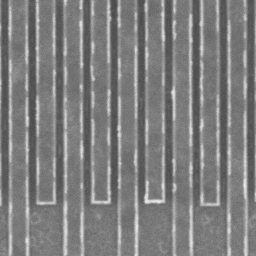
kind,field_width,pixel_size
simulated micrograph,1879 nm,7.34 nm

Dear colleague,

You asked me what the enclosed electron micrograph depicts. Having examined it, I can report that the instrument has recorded parallel lines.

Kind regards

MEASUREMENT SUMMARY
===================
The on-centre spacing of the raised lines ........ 0.201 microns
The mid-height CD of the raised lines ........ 136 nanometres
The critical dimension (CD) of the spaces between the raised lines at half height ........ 64.2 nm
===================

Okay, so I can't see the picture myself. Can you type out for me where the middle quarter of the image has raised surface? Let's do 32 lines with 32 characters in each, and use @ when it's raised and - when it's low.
@@@@@--@@@@---@@@@---@@@@--@@@@@
@@@@---@@@@---@@@@---@@@@--@@@@@
@@@@---@@@@---@@@@---@@@@--@@@@@
@@@@---@@@@---@@@@---@@@@--@@@@@
@@@@---@@@@---@@@@---@@@@--@@@@@
@@@@---@@@@---@@@@---@@@@--@@@@@
@@@@---@@@@@--@@@@---@@@@--@@@@@
@@@@---@@@@@--@@@@---@@@@--@@@@@
@@@@---@@@@@--@@@@---@@@@--@@@@@
@@@@---@@@@@--@@@@---@@@@--@@@@@
@@@@---@@@@@--@@@@---@@@@--@@@@@
@@@@---@@@@@--@@@@---@@@@--@@@@@
@@@@---@@@@---@@@@---@@@@--@@@@@
@@@@---@@@@---@@@@---@@@@--@@@@@
@@@@---@@@@---@@@@---@@@@--@@@@@
@@@@---@@@@---@@@@---@@@@--@@@@@
@@@@---@@@@---@@@@---@@@@--@@@@@
@@@@---@@@@---@@@@---@@@@--@@@@@
@@@@---@@@@@--@@@@---@@@@--@@@@@
@@@@---@@@@@--@@@@---@@@@--@@@@@
@@@@@--@@@@@--@@@@---@@@@--@@@@@
@@@@@--@@@@@--@@@@---@@@@--@@@@@
@@@@@--@@@@---@@@@---@@@@--@@@@@
@@@@@--@@@@---@@@@---@@@@--@@@@@
@@@@@--@@@@---@@@@---@@@@--@@@@@
@@@@@--@@@@---@@@@---@@@@--@@@@@
@@@@@--@@@@@--@@@@---@@@@--@@@@@
@@@@@--@@@@@--@@@@---@@@@--@@@@@
@@@@@--@@@@---@@@@---@@@@--@@@@@
@@@@@--@@@@---@@@@---@@@@--@@@@@
@@@@@--@@@@---@@@@---@@@@--@@@@@
@@@@@--@@@@@--@@@@---@@@@--@@@@@